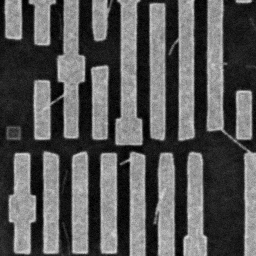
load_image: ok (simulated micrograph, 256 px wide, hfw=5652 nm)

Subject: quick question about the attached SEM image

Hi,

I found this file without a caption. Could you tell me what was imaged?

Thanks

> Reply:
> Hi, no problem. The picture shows wiring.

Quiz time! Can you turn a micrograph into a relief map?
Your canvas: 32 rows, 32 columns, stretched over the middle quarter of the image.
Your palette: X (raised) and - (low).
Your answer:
XXXXX---------XXXX----XXX----XXX
XXXXX--XXXX---XXXX----XXX----XXX
XXXXX--XXXX---XXXX----XXX----XXX
XXXXX--XXXX---XXXX----XXX----XXX
XXXXX--XXXX---XXXX----XXX----XXX
XXX----XXXX---XXXX----XXX----XXX
XXX----XXXX---XXXX----XXX----XXX
XXX----XXXX---XXXX----XXX----XXX
XXX----XXXX---XXXX----XXX----XXX
XXX----XXXX---XXXX----XXX----XXX
XXX----XXXX---XXXX----XXX----XXX
XXX----XXXX---XXXX----XXX----XXX
XXX----XXXX---XXXX----XXX----XXX
XXX----XXXX---XXXXX---XXX----XXX
XXX----XXXX--XXXXXX---XXX----XXX
XXX----XXXX--XXXXXX---XXX----XXX
XXX----XXXX--XXXXXX---XXX----XXX
XXX----XXXX--XXXXXX---XXX----XXX
-------XXX---XXXXXX---XXX----XXX
-------------XXXXXX-------------
--------------------------------
--------------------------------
---XXX----XXX----XX-----XXX----X
--XXXX---XXXX---XXXX----XXX----X
--XXXX---XXXX---XXXX----XXX----X
--XXXX---XXXX----XXX----XXX----X
--XXXX---XXXX----XXX----XXX----X
--XXXX---XXXX----XXX----XXX----X
--XXXX---XXXX----XXX----XXX----X
--XXXX---XXXX----XXX----XXX----X
--XXXX---XXXX----XXX----XXX----X
--XXXX---XXXX----XXX----XXX----X